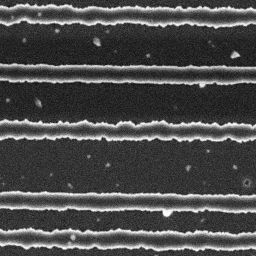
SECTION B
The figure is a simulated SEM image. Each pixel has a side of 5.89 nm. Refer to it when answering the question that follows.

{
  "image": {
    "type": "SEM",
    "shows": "lines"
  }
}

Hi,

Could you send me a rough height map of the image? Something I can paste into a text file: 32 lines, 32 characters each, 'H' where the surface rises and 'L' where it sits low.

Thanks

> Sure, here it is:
LLLLLLLLLLLLLLLLLLLLLLLLLLLLLLLL
HHHHHHHHHHHHHHHHHHHHHHHHHHHHHHHH
HHHHHHHHHHHHHHHHHHHHHHHHHHHHHHHH
LLLLLLLLLLLLLLLLLLLLLLLLLLLLLLLL
LLLLLLLLLLLLLLLLLLLLLLLLLLLLLLLL
LLLLLLLLLLLLLLLLLLLLLLLLLLLLLLLL
LLLLLLLLLLLLLLLLLLLLLLLLLLLLLLLL
LLLLLLLLLLLLLLLLLLLLLLLLLLLLLLLL
HHHHHHHHHHHHHHHHHHHHHHHHHHHHHHHH
HHHHHHHHHHHHHHHHHHHHHHHHHHHHHHHH
LLLLLLLLLLLLLLLLLLLLLLLHLHLHHLLL
LLLLLLLLLLLLLLLLLLLLLLLLLLLLLLLL
LLLLLLLLLLLLLLLLLLLLLLLLLLLLLLLL
LLLLLLLLLLLLLLLLLLLLLLLLLLLLLLLL
LLLLLLLLLLLLLLLLLLLLLLLLLLLLLLLL
HHHHHHHHHHHHHHHHHHHHHHHHHHHLHHHL
HHHHHHHHHHHHHHHHHHHHHHHHHHHHHHHH
LLLLLLLLLLLLLLLLLLLLLLHHLLHHLHHL
LLLLLLLLLLLLLLLLLLLLLLLLLLLLLLLL
LLLLLLLLLLLLLLLLLLLLLLLLLLLLLLLL
LLLLLLLLLLLLLLLLLLLLLLLLLLLLLLLL
LLLLLLLLLLLLLLLLLLLLLLLLLLLLLLLL
LLLLLLLLLLLLLLLLLLLLLLLLLLLLLLLL
LLLLLLLLLLLLLLLLLLLLLLLLLLLLLLLL
HHHHHHHHHHHHHHHHHHHHHHHHHHHHHHLH
HHHHHHHHHHHHHHHHHHHHHHHHHHHHHHHH
LLLLLLLLLLLLLLLLLLLLHLLLLLLLLHLL
LLLLLLLLLLLLLLLLLLLLLLLLLLLLLLLL
LLLLLLLLLLLLLLLLLLLLLLLLLLLLLLLL
HHHHHHHHHHHHHHHHHHHHHHHHHHHHHHHH
HHHHHHHHHHHHHHHHHHHHHHHHHHHHHHHH
LLLLLLLLLLLLLLLLLLLLLLLLLLLLLLLL